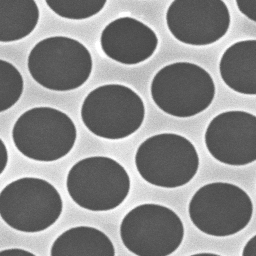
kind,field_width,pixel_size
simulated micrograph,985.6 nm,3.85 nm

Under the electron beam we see a regular array of holes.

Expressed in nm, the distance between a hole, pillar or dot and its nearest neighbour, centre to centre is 278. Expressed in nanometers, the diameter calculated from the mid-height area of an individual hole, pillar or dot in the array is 228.